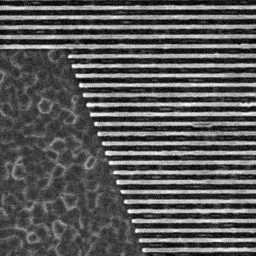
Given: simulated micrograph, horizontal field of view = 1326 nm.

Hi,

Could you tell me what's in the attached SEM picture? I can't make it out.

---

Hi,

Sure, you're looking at parallel lines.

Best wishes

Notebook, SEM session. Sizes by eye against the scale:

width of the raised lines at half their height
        14.9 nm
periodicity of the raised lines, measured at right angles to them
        50.3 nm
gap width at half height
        34.3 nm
